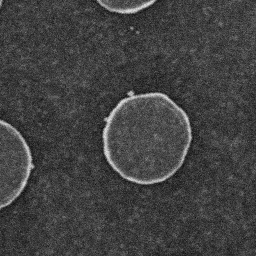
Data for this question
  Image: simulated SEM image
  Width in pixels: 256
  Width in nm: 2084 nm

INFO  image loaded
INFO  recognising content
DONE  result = raised bodies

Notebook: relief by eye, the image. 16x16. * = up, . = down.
.......**.......
................
................
................
................
................
........***.....
.......*****....
*......*****....
**.....*****....
**.....****.....
**..............
*...............
................
................
................